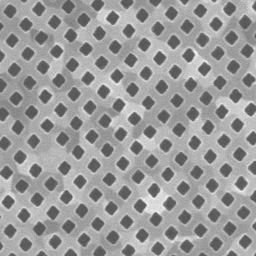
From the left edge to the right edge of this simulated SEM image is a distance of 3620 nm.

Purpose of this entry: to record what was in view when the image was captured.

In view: a regular array of holes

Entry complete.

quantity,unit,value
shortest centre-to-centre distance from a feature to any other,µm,0.288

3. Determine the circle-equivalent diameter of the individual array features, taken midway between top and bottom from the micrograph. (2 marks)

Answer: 0.182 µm